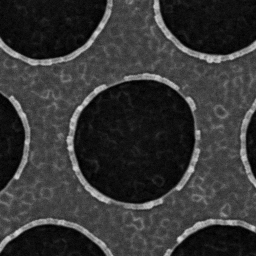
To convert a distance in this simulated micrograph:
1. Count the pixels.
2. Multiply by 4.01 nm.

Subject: holes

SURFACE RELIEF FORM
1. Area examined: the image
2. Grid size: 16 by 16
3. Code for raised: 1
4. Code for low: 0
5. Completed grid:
0000000111000000
0000001111000000
0000001111100000
1100111111111111
1111111111111111
1111111000011111
0111100000001111
0111100000001111
0011100000001110
0111100000001110
0111100000001111
1111110000011111
1111111000111111
1111111111111111
1000011111110000
0000001111100000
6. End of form